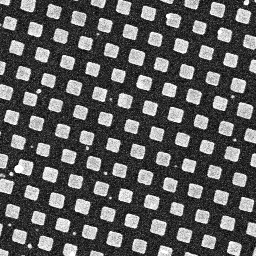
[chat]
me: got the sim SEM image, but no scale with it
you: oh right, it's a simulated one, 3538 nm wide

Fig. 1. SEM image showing a regular array of raised bodies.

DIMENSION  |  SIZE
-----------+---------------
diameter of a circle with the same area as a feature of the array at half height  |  196 nm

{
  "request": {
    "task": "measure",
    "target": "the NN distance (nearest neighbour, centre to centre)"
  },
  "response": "0.355 µm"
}